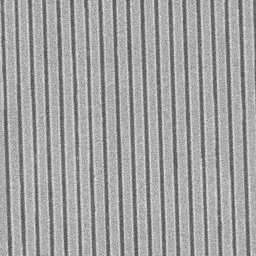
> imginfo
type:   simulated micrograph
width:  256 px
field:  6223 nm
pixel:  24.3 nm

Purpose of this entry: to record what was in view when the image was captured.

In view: parallel lines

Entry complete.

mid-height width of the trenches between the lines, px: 5.62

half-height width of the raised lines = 206 nanometers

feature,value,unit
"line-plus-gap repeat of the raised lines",341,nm